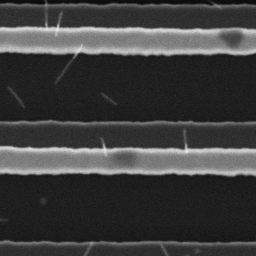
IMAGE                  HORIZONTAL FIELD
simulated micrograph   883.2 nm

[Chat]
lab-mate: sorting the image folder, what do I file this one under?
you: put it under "lines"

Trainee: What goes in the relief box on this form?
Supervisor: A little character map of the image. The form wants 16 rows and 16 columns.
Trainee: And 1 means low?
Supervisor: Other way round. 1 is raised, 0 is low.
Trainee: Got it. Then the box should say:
1111111111111111
1111111111111111
1111111111111111
0000000000000000
0000000000000000
0000000000000000
0000000000000000
0000000000000000
1111111111111111
1111111111111111
1111111111111111
0000000000000000
0000000000000000
0000000000000000
0000000000000000
1111111111111111